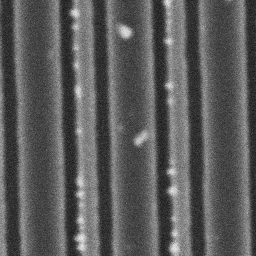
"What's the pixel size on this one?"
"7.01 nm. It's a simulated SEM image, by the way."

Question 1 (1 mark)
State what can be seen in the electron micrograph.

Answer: lines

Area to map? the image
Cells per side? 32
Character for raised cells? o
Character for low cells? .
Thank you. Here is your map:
..ooooo..oo...ooooo..oo..ooooo..
..ooooo..oo...ooooo..oo..ooooo..
..ooooo..oo...ooooo..oo..ooooo..
..ooooo..ooo..ooooo..oo..oooooo.
..ooooo..ooo..ooooo..oo..oooooo.
..ooooo..ooo..ooooo..oo..oooooo.
..ooooo..ooo..ooooo..oo..oooooo.
..ooooo..ooo..ooooo..oo..oooooo.
..ooooo..ooo..ooooo..oo..oooooo.
..ooooo...oo..ooooo..oo..oooooo.
..ooooo...oo..ooooo..oo..oooooo.
..ooooo...oo..ooooo..oo..oooooo.
..oooooo..oo..ooooo..oo..oooooo.
..oooooo..oo..ooooo..oo..oooooo.
..oooooo..oo..ooooo..oo..oooooo.
..oooooo..oo..ooooo..oo...ooooo.
..oooooo..oo..ooooo..oo...ooooo.
..oooooo..oo..ooooo..oo...ooooo.
...ooooo..oo..ooooo..oo...ooooo.
...ooooo..oo..ooooo..oo...ooooo.
...ooooo..oo..ooooo..oo...ooooo.
...ooooo..oo..ooooo..oo...ooooo.
...ooooo..oo..ooooo...o...ooooo.
...ooooo..oo..ooooo..ooo..ooooo.
...ooooo..oo..ooooo...oo..ooooo.
...ooooo..oo..ooooo...oo..ooooo.
o..ooooo..oo..oooooo..oo..ooooo.
o..ooooo..oo..oooooo..oo..ooooo.
o..ooooo..oo..oooooo..oo..ooooo.
o..ooooo..oo..oooooo..oo..ooooo.
o..ooooo..oo..oooooo..oo..ooooo.
o..ooooo..oo..oooooo.ooo..ooooo.